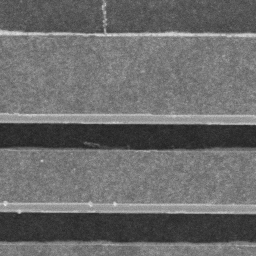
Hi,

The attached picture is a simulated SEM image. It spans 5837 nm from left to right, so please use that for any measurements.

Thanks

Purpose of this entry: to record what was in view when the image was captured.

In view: lines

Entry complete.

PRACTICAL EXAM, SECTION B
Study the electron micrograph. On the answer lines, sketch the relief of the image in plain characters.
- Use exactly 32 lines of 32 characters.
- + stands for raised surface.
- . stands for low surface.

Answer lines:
................................
................................
................................
................................
+++++++++++++++++...............
++++++++++++++++++++++++++++++++
++++++++++++++++++++++++++++++++
++++++++++++++++++++++++++++++++
++++++++++++++++++++++++++++++++
++++++++++++++++++++++++++++++++
++++++++++++++++++++++++++++++++
++++++++++++++++++++++++++++++++
++++++++++++++++++++++++++++++++
++++++++++++++++++++++++++++++++
++++++++++++++++++++++++++++++++
.........................+++++++
................................
................................
................................
++++++++++++++++++++++++++++++++
++++++++++++++++++++++++++++++++
++++++++++++++++++++++++++++++++
++++++++++++++++++++++++++++++++
++++++++++++++++++++++++++++++++
++++++++++++++++++++++++++++++++
++++++++++++++++++++++++++++++++
..+.++++++++++++++++++++++++++++
................................
................................
................................
+...............................
++++++++++++++++++++++++++++++++